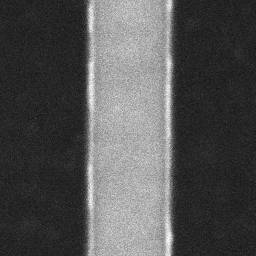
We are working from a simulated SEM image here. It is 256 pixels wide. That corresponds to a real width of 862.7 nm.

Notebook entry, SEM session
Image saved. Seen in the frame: one or a few lines or trenches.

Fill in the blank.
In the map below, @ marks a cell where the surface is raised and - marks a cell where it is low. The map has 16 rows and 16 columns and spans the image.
@@@@@@----@@@@@@
@@@@@@----@@@@@@
@@@@@@----@@@@@@
@@@@@@----@@@@@@
@@@@@@----@@@@@@
@@@@@@----@@@@@@
@@@@@@----@@@@@@
@@@@@@----@@@@@@
@@@@@@----@@@@@@
@@@@@@-----@@@@@
@@@@@@----@@@@@@
@@@@@@----@@@@@@
@@@@@@----@@@@@@
@@@@@@----@@@@@@
@@@@@@----@@@@@@
@@@@@@----@@@@@@